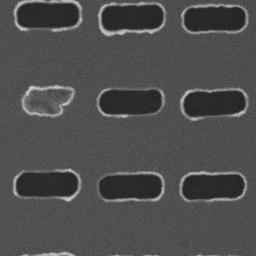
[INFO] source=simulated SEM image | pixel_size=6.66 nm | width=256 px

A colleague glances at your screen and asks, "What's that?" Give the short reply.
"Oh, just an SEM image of a regular array of holes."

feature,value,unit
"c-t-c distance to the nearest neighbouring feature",0.553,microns